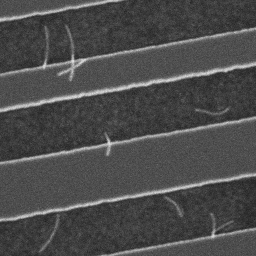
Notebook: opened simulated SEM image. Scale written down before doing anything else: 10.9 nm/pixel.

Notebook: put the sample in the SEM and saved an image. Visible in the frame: lines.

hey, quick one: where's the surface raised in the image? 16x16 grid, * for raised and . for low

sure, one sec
*****...........
................
............****
......**********
.*************..
********........
***.............
...............*
.........*******
....************
****************
*************...
********........
**..............
..............**
.........*******